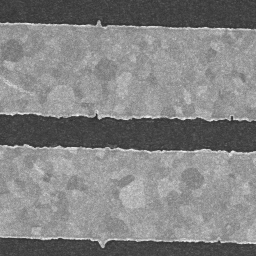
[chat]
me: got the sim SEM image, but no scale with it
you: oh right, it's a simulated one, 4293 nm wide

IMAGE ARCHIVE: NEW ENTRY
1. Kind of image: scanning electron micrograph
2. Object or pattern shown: one or a few lines or trenches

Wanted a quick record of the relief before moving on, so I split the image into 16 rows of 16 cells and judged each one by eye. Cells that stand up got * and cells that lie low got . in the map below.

................
**..............
****************
****************
****************
****************
****************
.............*.*
................
**************..
****************
****************
****************
****************
****************
................